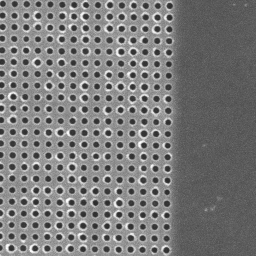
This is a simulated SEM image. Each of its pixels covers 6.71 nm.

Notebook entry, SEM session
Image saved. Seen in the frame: a regular array of holes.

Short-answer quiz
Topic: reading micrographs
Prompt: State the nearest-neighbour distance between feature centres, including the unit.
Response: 76.7 nm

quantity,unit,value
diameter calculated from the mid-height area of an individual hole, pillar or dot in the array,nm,42.9